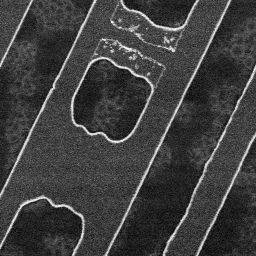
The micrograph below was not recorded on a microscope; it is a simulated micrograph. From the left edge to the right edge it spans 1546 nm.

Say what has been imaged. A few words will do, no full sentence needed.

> one or a few lines or trenches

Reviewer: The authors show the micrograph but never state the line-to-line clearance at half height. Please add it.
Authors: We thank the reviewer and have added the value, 315 nanometers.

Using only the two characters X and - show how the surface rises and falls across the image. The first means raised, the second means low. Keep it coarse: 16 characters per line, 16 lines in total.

XX----XX----XX--
X----XXXXX-XXX--
X----XXXXXXXX---
----XXXXXXXXX---
----X---XXXX----
---XX----XXX---X
---XX----XX----X
--XXX----XX---XX
--XXXXX-XX----XX
-XXXXXXXXX---XX-
-XXXXXXXX----XX-
XXXXXXXXX---XX--
XX-XXXXX----XX--
X----XXX----XX--
-----XX----XX---
-----XX---XXX---